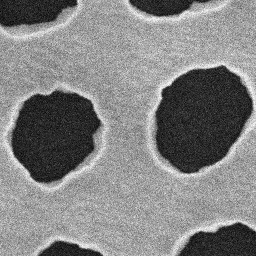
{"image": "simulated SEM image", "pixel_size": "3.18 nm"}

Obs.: holes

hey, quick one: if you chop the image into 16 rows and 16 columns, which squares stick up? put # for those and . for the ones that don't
.....###....####
....############
################
################
############...#
##########.....#
#.....####......
#.....####......
#.....####.....#
#.....####....##
##...######..###
################
################
################
#############...
###..######.....